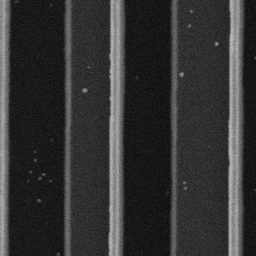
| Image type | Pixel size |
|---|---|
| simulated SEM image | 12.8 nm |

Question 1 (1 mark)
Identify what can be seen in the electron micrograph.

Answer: lines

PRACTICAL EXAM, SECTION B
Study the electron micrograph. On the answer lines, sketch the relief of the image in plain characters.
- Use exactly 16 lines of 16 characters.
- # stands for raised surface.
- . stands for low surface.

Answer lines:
....####...####.
....####...####.
....####...####.
....###....####.
....###....####.
....###....####.
....###....####.
....###....####.
....###....####.
....###....####.
....###....####.
....###....####.
....###....####.
....###....####.
....###....####.
....###....####.